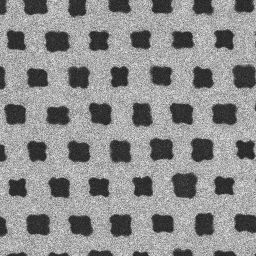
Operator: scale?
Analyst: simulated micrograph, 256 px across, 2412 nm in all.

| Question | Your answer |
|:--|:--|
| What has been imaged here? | a regular array of holes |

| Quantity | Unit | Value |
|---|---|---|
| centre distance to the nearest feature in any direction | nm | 384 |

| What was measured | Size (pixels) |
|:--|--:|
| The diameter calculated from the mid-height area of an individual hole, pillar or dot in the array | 21.2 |